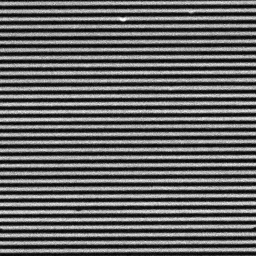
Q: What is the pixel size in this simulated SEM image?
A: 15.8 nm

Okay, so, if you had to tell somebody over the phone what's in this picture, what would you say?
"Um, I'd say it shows parallel lines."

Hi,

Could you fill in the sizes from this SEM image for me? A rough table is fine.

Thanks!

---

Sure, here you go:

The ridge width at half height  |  61.4 nm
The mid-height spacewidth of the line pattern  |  61.4 nm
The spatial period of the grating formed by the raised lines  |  7.72 pixels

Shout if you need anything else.